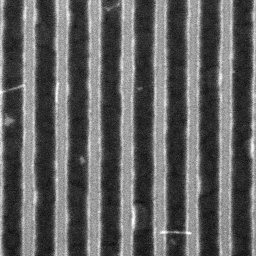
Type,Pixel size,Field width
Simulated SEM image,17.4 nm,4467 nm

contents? parallel lines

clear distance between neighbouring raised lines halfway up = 0.157 um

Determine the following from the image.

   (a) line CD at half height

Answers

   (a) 408 nm